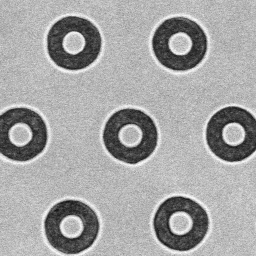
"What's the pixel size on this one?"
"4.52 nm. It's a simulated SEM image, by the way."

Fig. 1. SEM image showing ring-shaped grooves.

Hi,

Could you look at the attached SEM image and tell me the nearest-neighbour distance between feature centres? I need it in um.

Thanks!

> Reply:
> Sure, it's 0.47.